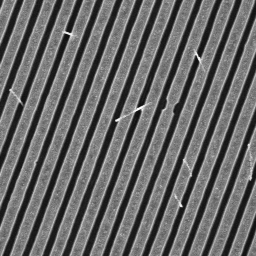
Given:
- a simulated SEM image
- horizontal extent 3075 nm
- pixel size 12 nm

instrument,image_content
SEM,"parallel lines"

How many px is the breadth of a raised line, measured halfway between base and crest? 11.4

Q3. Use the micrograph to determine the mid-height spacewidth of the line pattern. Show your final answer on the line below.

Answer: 0.0803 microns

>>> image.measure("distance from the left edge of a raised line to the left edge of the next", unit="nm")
224